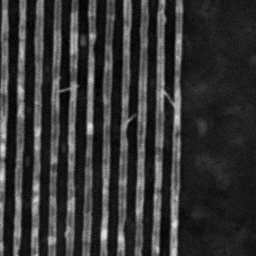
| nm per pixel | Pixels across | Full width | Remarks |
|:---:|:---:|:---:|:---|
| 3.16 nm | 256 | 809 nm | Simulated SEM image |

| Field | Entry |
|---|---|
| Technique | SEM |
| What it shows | parallel lines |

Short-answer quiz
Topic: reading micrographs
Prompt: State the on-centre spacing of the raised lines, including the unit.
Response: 54.8 nanometres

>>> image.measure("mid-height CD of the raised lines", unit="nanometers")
17.7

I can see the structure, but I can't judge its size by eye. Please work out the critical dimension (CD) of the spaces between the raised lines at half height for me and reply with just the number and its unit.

0.0359 um